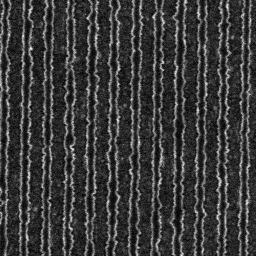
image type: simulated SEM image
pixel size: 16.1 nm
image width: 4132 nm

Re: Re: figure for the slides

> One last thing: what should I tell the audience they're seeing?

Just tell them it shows parallel lines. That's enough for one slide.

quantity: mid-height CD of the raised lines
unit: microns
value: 0.127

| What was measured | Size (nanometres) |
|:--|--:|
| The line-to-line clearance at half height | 218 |